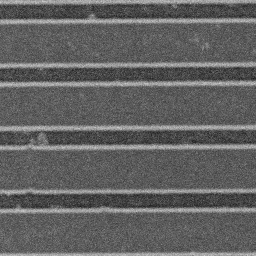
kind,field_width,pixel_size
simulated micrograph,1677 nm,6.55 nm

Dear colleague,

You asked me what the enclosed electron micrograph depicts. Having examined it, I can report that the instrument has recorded parallel lines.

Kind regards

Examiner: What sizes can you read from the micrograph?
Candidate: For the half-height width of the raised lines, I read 294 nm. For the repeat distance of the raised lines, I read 414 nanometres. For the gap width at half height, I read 0.12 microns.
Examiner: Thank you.